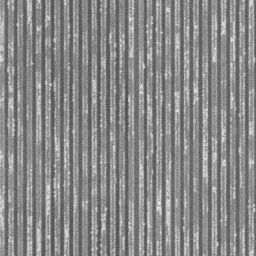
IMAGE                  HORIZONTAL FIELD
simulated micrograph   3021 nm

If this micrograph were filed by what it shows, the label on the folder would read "parallel lines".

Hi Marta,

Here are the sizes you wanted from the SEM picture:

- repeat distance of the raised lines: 109 nanometres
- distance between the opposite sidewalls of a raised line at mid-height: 0.056 um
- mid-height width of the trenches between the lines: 56 nanometres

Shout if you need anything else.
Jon